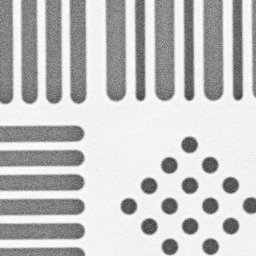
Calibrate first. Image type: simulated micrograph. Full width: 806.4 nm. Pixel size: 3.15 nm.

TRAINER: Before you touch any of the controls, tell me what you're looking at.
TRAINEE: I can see groups of lines, slits or small figures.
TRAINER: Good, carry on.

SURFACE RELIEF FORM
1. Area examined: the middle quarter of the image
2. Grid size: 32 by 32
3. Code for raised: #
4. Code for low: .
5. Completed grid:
#.....####......##...#......##..
#.....####......##...#......##..
#.....####......##...#......##..
#.....####......##...#......##..
#.....####......##...#......##..
#.....####......##...#......##..
#.....####......##...#......##..
#.....#####.....##...##.....##..
##....#####....###..###....###..
##...###########################
################################
################################
################################
################################
################################
....############################
.....###########################
.....###########################
.....#########################..
...##########################...
#############################...
...###########################..
.....##########################.
.....####################...####
.....###################....####
....####################.....###
########################....####
....############################
.....###############..########..
.....##############....#######..
.....##############.....#####...
....###############....#######..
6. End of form